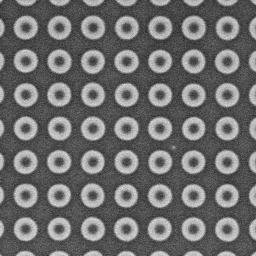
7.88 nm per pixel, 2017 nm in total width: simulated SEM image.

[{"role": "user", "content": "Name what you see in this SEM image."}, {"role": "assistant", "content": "an array of small figures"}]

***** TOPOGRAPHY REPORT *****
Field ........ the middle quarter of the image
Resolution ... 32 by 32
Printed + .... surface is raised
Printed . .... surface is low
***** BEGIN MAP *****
++...+++++...+++++...+++++....++
+....++++.....++++....++++.....+
................................
................................
................................
+....++++.....+++.....++++.....+
+....+++++...+++++....++++....++
++..++++++...+++++...++++++...++
++...+++++...+++++...++++++...++
+....+++++...+++++....++++....++
................................
................................
................................
......++.......+................
+....+++++...+++++....++++....++
++..++++++...+++++...++++++...++
++..++++++...+++++...++++++...++
+....+++++...+++++...+++++....++
......+++.....+++.....++++.....+
................................
................................
................................
+....++++....+++++....++++....++
+....+++++...+++++...++++++...++
++..++++++...+++++...++++++...++
+...++++++...+++++...++++++...++
+....++++.....++++....++++....++
................................
................................
................................
.....++++.....+++......++......+
+....+++++...+++++....++++....++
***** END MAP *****